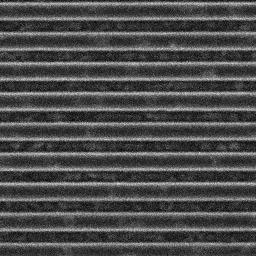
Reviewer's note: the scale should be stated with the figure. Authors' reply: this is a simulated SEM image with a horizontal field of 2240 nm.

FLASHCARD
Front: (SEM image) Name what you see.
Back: parallel lines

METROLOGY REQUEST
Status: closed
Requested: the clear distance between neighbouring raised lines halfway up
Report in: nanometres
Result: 113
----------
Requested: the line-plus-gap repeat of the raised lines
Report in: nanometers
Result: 263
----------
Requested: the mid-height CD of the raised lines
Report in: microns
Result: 0.153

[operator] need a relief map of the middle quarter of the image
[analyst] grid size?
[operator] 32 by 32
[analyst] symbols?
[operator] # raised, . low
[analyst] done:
################################
################################
################################
################################
................................
................................
................................
################################
################################
################################
################################
................................
................................
................................
................................
################################
################################
################################
################################
................................
................................
................................
################################
################################
################################
################################
................................
................................
................................
................................
################################
################################